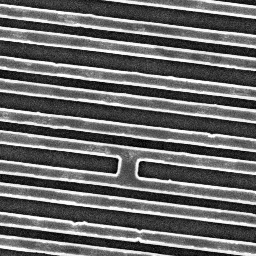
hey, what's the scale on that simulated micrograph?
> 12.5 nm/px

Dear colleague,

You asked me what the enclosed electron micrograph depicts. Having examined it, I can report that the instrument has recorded parallel lines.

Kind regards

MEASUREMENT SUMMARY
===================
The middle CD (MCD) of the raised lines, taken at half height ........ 144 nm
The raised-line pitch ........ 323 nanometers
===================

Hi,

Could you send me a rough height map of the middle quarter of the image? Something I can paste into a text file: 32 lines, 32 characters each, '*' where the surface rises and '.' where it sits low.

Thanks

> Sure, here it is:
................................
**********......................
*******************.............
....***********************.....
.............*******************
......................**********
*****........................***
************....................
********************............
........********************....
................****************
........................********
................................
**..............................
***********.....................
*****************...............
....***********************.....
............********************
....................************
****...........................*
************....................
.*******************............
........********************.*..
..............******************
..............****......********
..............****..............
*.............****..............
*********....*****..............
*******************.............
.....********************.*.....
.............*******************
.....................***********